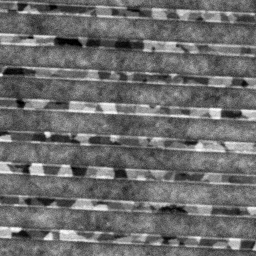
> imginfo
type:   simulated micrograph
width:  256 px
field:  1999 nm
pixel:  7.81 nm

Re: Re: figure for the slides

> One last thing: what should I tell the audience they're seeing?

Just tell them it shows parallel lines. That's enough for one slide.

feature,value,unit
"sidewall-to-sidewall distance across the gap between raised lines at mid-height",23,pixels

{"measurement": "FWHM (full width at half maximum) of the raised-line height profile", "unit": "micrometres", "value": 0.078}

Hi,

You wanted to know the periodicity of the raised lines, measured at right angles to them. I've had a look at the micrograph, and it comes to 252 nm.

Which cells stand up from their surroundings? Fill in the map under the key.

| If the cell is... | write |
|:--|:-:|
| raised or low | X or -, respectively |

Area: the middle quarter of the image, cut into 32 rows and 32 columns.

--------------------------------
XXXXX---------------------------
XXXXXXXXXXXXXXXXXXXXXXXXX-------
XXXXXXXXXXXXXXXXXXXXXXXXXXXXXXXX
-------------------XXXXXXXXXXXXX
--------------------------------
--------------------------------
--------------------------------
--------------------------------
--------------------------------
XXXXXXXXXXXXXXXXXXXX------------
XXXXXXXXXXXXXXXXXXXXXXXXXXXXXXXX
-------------------XXXXXXXXXXXXX
--------------------------------
--------------------------------
--------------------------------
--------------------------------
--------------------------------
XXXXXXXXXXXXXXXXXXXX------------
XXXXXXXXXXXXXXXXXXXXXXXXXXXXXXXX
--------------XXXXXXXXXXXXXXXXXX
--------------------------------
--------------------------------
--------------------------------
--------------------------------
--------------------------------
XXXXXXXXXXXXXXXXXXXX------------
XXXXXXXXXXXXXXXXXXXXXXXXXXXXXXXX
--------------XXXXXXXXXXXXXXXXXX
--------------------------------
--------------------------------
--------------------------------